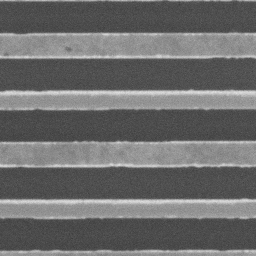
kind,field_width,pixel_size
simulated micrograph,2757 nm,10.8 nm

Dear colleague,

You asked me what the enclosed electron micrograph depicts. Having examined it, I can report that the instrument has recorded lines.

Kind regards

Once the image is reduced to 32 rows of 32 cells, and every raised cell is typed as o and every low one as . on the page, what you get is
................................
................................
................................
................................
oooooooooooooooooooooooooooooooo
oooooooooooooooooooooooooooooooo
oooooooooooooooooooooooooooooooo
................................
................................
................................
................................
.oo..ooooooooooooooooooooooooooo
oooooooooooooooooooooooooooooooo
oooooooooooooooooooooooooooooooo
................................
................................
................................
................................
oooooooooooooooooooooooooooooooo
oooooooooooooooooooooooooooooooo
oooooooooooooooooooooooooooooooo
................................
................................
................................
................................
oooooooooooooooooooooooooooooooo
oooooooooooooooooooooooooooooooo
................................
................................
................................
................................
oooooooooooooooooooooooooooooooo